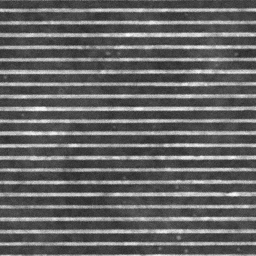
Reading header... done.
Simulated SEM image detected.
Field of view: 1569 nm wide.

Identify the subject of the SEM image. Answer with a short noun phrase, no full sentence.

parallel lines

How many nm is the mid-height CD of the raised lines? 16.1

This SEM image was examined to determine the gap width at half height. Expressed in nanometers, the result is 56.7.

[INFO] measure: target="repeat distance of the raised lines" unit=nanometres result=75.3